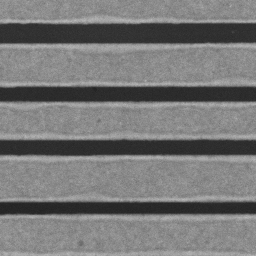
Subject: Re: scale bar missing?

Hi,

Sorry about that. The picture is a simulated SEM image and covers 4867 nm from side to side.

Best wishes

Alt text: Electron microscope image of lines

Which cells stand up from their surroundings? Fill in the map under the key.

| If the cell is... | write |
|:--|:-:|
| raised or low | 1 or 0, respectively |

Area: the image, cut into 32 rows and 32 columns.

11111111111111111111111111111111
11111111111111111111111111111111
11111111111111111111111111111111
00000000000000000000000000000000
00000000000000000000000000000000
00000000000000000000000000000000
11111111111111111111111111111111
11111111111111111111111111111111
11111111111111111111111111111111
11111111111111111111111111111111
11111111111111111111111111111111
00000000000000000000000000000000
00000000000000000000000000000000
11111111111111111111111111111111
11111111111111111111111111111111
11111111111111111111111111111111
11111111111111111111111111111111
00000000000000000000000000000000
00000000000000000000000000000000
00000000000000000000000000000000
11111111111111111111111111111111
11111111111111111111111111111111
11111111111111111111111111111111
11111111111111111111111111111111
11111111111111111111111111111111
00000000000000000000000000000000
00000000000000000000000000000000
11111111111111111111111111111111
11111111111111111111111111111111
11111111111111111111111111111111
11111111111111111111111111111111
11111111111111111111111111111111